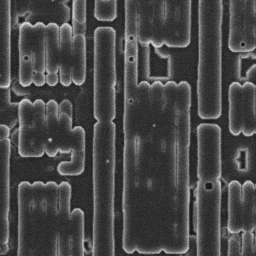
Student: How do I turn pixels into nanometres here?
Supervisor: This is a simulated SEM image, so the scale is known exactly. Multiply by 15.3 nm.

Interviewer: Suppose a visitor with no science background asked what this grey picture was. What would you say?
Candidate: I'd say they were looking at wiring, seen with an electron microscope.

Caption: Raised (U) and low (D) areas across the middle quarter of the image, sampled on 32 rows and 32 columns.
UUUUUDDDUUUUUDDUUUDDDDDDDDDDDDDD
UUUUUDDDUUUUUDDUUUDDDDDDDDDDDDDD
UUUUUDDDUUUUUDDUUUDDDDDDDDDDDDDD
UUUUUDDDUUUUUDDUUUDDDDDDDDDDDDDD
UUUUUDDDUUUUUDDUUUDUUDDUDDUUDUUD
DDDDDDDDUUUUDDDUUUUUUUUUUUUUUUUD
DDDDDDDDUUUUUDDUUUUUUUUUUUUUUUUU
DDDDDDDDUUUUUDDUUUUUUUUUUUUUUUUU
DDDDDDDDUUUUUDDUUUUUUUUUUUUUUUUU
DDDDDDDDUUUUUDDUUUUUUUUUUUUUUUUU
DDDDDDDDUUUUUDDUUUUUUUUUUUUUUUUU
DDDDDDDDUUUUUDDUUUUUUUUUUUUUUUUD
UDDDDDDDUUUUUDDUUUUUUUUUUUUUUUUD
UUDDDDDDUUUUUDDUUUUUUUUUUUUUUUUD
UUDDDDDDUUUUDDDUUUUUUUUUUUUUUUUD
UUDDDDDDUUUUUDDUUUUUUUUUUUUUUUUD
UUUUUDDDUUUUUDDUUUUUUUUUUUUUUUUD
UUUUUDDDUUUUUDDUUUUUUUUUUUUUUUUD
UUUUUDDUUUUUUDDUUUUUUUUUUUUUUUUD
UUUUUDDUUUUUDDDUUUUUUUUUUUUUUUUD
UUUUUDDUUUUUDDDUUUUUUUUUUUUUUUUD
UUUUUDDUUUUUUDDUUUUUUUUUUUUUUUUD
DDUUUDDUUUUUUDDUUUUUUUUUUUUUUUUD
DDUUUDDUUUUUUDDUUUUUUUUUUUUUUUUD
UUUUUDDUUUUUUDDUUUUUUUUUUUUUUUUD
UUUUUDDUUUUUUDDUUUUUUUUUUUUUUUUD
UUUUUDDUUUUUDDDUUUUUUUUUUUUUUUUD
UUUUDDDUUUUUDDDUUUUUUUUUUUUUUUUD
DDDDDDDUUUUUDDDUUUUUUUUUUUUUUUUD
DDDDDDDUUUUUDDDUUUUUUUUUUUUUUUUD
UUDDDDDDUUUUDDDUUUUUUUUUUUUUUUUD
UUDDDDDDUUUUDDDUUUUUUUUUUUUUUUUD